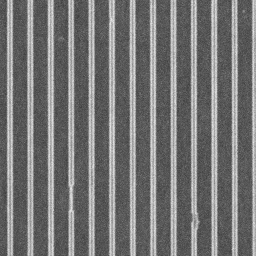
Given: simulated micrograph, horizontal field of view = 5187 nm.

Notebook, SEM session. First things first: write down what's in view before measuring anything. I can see parallel lines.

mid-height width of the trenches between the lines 329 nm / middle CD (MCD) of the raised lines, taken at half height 78.5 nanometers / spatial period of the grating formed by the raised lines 413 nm